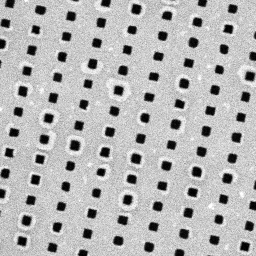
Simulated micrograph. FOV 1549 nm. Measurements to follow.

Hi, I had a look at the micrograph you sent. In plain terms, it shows a regular array of holes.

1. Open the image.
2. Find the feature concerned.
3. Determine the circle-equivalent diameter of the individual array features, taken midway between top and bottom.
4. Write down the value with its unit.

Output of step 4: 60.3 nm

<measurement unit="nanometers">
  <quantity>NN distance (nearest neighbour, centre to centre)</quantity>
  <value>126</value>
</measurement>